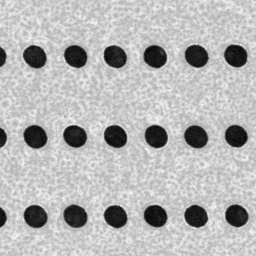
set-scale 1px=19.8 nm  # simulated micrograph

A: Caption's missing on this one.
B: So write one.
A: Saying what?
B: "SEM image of a regular array of holes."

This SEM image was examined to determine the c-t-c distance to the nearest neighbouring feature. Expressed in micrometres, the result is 0.789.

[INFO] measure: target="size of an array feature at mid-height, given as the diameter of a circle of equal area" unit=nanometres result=469